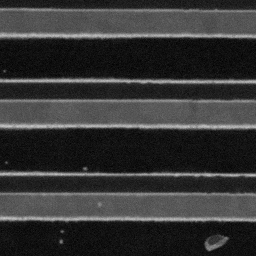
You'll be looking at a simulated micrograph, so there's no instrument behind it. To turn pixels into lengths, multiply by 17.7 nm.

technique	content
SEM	lines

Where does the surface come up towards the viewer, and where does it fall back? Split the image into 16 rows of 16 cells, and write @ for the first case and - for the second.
@@@@@@@@@@@@@@@@
@@@@@@@@@@@@@@@@
----------------
----------------
----------------
@@@@@@@@@@@@@@@@
@@@@@@@@@@@@@@@@
@@@@@@@@@@@@@@@@
----------------
----------------
----------------
@@@@@@@@@@@@@@@@
@@@@@@@@@@@@@@@@
@@@@@@@@@@@@@@@@
----------------
----------------